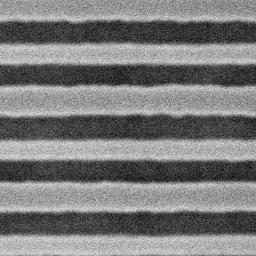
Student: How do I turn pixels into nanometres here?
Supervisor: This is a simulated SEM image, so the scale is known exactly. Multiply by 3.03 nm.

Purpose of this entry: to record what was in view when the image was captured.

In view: lines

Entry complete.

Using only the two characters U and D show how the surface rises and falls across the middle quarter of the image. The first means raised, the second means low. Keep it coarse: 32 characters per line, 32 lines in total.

DDDDDDDDDDDDDDDDDDDDDDDDDDDDDDDD
DDDDDDDDDDDDDDDDDDDDDDDDDDDDDDDD
DDDDDDDDDDDDDDDDDDDDDDDDDDDDDDDD
DDDDDDDDDDDDDDDDDDDDDDDDDDDDDDDD
DDDDDDDDDDDDDDDDDDDDDDDDDDDDDDDD
DDDDDDDDDDDDDDDDDDDDDDDDDDDUDDDD
UUUUUUUUUUUUUUUUUUUUUUUUUUUUUUUU
UUUUUUUUUUUUUUUUUUUUUUUUUUUUUUUU
UUUUUUUUUUUUUUUUUUUUUUUUUUUUUUUU
UUUUUUUUUUUUUUUUUUUUUUUUUUUUUUUU
UUUUUUUUUUUUUUUUUUUUUUUUUUUUUUUU
UUUUUUUUUUUUUUUUUUUUUUUUUUUUUUUU
UUDDDDDDDDDDDUUDDDDDDUDDDDDUUUDD
DDDDDDDDDDDDDDDDDDDDDDDDDDDDDDDD
DDDDDDDDDDDDDDDDDDDDDDDDDDDDDDDD
DDDDDDDDDDDDDDDDDDDDDDDDDDDDDDDD
DDDDDDDDDDDDDDDDDDDDDDDDDDDDDDDD
DDDDDDDDDDDDDDDDDDDDDDDDDDDDDDDD
DDDDDDDDDDDDDDDDDDDDDDDDDDDDDDDD
UUDUUUUUUUUUUUUUUUUUUUUUUUUUUUUU
UUUUUUUUUUUUUUUUUUUUUUUUUUUUUUUU
UUUUUUUUUUUUUUUUUUUUUUUUUUUUUUUU
UUUUUUUUUUUUUUUUUUUUUUUUUUUUUUUU
UUUUUUUUUUUUUUUUUUUUUUUUUUUUUUUU
DDDDDDDDDDDDDDDDDDDDDDDDDDDDDDDD
DDDDDDDDDDDDDDDDDDDDDDDDDDDDDDDD
DDDDDDDDDDDDDDDDDDDDDDDDDDDDDDDD
DDDDDDDDDDDDDDDDDDDDDDDDDDDDDDDD
DDDDDDDDDDDDDDDDDDDDDDDDDDDDDDDD
DDDDDDDDDDDDDDDDDDDDDDDDDDDDDDDD
UUUUUUUUUUUUUUUUUUUUUUUUUUUUUUUU
UUUUUUUUUUUUUUUUUUUUUUUUUUUUUUUU